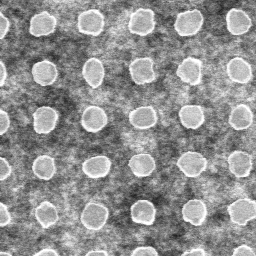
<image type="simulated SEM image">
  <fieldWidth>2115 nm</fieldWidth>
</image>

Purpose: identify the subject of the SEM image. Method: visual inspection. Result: a regular array of raised bodies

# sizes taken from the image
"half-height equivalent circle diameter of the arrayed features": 199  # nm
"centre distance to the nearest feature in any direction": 386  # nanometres